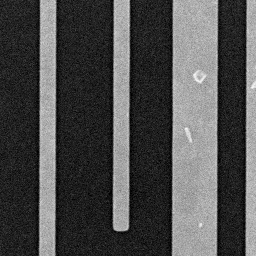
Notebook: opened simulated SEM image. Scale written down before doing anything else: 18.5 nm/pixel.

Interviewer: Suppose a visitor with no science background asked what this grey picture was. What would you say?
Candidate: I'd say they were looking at groups of lines, slits or small figures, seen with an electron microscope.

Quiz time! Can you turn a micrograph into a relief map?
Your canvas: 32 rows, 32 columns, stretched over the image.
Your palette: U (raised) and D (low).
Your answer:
DDDDDUUDDDDDDDUUDDDDDDUUUUUDDDDU
DDDDDUUDDDDDDDUUDDDDDDUUUUUDDDDU
DDDDDUUDDDDDDDUUDDDDDDUUUUUDDDDU
DDDDDUUDDDDDDDUUDDDDDDUUUUUDDDDU
DDDDDUUDDDDDDDUUDDDDDDUUUUUDDDDU
DDDDDUUDDDDDDDUUDDDDDDUUUUUDDDDU
DDDDDUUDDDDDDDUUDDDDDDUUUUUDDDDU
DDDDDUUDDDDDDDUUDDDDDDUUUUUDDDDU
DDDDDUUDDDDDDDUUDDDDDDUUUUUDDDDU
DDDDDUUDDDDDDDUUDDDDDDUUUUUDDDDU
DDDDDUUDDDDDDDUUDDDDDDUUUUUDDDDU
DDDDDUUDDDDDDDUUDDDDDDUUUUUDDDDU
DDDDDUUDDDDDDDUUDDDDDDUUUUUDDDDU
DDDDDUUDDDDDDDUUDDDDDDUUUUUDDDDU
DDDDDUUDDDDDDDUUDDDDDDUUUUUDDDDU
DDDDDUUDDDDDDDUUDDDDDDUUUUUDDDDU
DDDDDUUDDDDDDDUUDDDDDDUUUUUDDDDU
DDDDDUUDDDDDDDUUDDDDDDUUUUUDDDDU
DDDDDUUDDDDDDDUUDDDDDDUUUUUDDDDU
DDDDDUUDDDDDDDUUDDDDDDUUUUUDDDDU
DDDDDUUDDDDDDDUUDDDDDDUUUUUDDDDU
DDDDDUUDDDDDDDUUDDDDDDUUUUUDDDDU
DDDDDUUDDDDDDDUUDDDDDDUUUUUDDDDU
DDDDDUUDDDDDDDUUDDDDDDUUUUUDDDDU
DDDDDUUDDDDDDDUUDDDDDDUUUUUDDDDU
DDDDDUUDDDDDDDUUDDDDDDUUUUUDDDDU
DDDDDUUDDDDDDDUUDDDDDDUUUUUDDDDU
DDDDDUUDDDDDDDUUDDDDDDUUUUUDDDDU
DDDDDUUDDDDDDDUUDDDDDDUUUUUDDDDU
DDDDDUUDDDDDDDDDDDDDDDUUUUUDDDDU
DDDDDUUDDDDDDDDDDDDDDDUUUUUDDDDU
DDDDDUUDDDDDDDDDDDDDDDUUUUUDDDDU